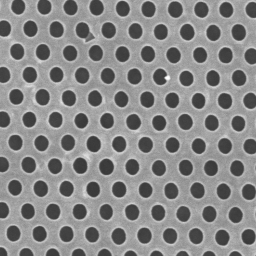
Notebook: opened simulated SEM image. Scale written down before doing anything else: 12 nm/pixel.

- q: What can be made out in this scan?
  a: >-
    a regular array of holes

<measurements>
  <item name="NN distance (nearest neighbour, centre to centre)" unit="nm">306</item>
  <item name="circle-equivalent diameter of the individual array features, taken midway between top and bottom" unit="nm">181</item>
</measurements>